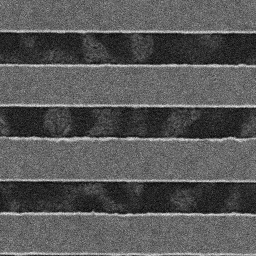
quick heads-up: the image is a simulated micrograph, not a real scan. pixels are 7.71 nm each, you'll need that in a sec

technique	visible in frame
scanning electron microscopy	one or a few lines or trenches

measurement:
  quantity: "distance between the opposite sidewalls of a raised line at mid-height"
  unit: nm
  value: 310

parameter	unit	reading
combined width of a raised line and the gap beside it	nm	572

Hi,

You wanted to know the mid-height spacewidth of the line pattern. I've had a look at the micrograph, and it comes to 258 nanometers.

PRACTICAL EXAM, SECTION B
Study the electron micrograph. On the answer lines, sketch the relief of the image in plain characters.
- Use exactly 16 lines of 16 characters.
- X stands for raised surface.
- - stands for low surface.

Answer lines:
XXXXXXXXXXXXXXXX
XXXXXXXXXXXXXXXX
----------------
----------------
XXXXXXXXXXXXXXXX
XXXXXXXXXXXXXXXX
XXXXXXXXXXXXXXXX
----------------
----------------
XXXXXXXXXXXXXXXX
XXXXXXXXXXXXXXXX
----------------
----------------
XXXXXXXXXXXXXXXX
XXXXXXXXXXXXXXXX
XXXXXXXXXXXXXXXX